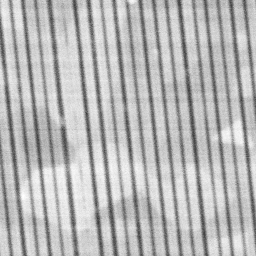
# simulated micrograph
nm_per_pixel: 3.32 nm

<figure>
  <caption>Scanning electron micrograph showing parallel lines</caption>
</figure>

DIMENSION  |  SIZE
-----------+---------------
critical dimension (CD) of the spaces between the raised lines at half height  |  13.2 nm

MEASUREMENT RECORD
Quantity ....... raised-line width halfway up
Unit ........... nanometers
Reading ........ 26.8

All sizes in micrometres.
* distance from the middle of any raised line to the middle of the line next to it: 0.0428